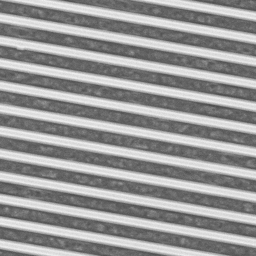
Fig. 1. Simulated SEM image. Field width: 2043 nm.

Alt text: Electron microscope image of parallel lines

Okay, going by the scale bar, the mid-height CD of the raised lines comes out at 63.9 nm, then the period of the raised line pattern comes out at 178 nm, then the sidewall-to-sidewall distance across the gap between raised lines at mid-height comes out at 0.114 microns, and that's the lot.